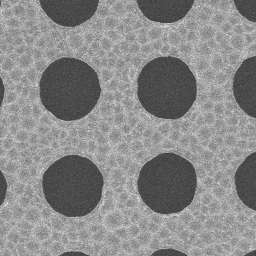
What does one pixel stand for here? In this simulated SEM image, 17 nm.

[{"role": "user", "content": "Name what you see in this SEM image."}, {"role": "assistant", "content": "holes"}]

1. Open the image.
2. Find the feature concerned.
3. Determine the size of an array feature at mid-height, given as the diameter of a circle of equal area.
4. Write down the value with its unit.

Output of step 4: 61.9 px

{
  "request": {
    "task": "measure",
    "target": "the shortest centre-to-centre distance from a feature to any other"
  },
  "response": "1620 nanometers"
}